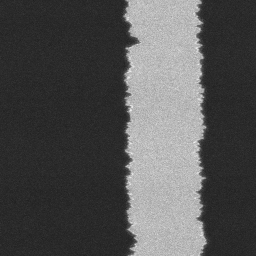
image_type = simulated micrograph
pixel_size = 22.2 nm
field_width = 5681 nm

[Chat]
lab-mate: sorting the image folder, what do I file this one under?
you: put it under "one or a few lines or trenches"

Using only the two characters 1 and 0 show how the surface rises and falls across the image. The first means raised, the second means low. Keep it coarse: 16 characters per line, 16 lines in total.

1111111100001111
1111111100001111
1111111100001111
1111111100001111
1111111100000111
1111111100000111
1111111100000111
1111111100000111
1111111100000111
1111111100001111
1111111100001111
1111111100000111
1111111100001111
1111111100001111
1111111100000111
1111111100000111